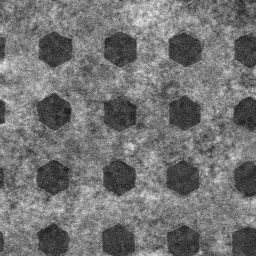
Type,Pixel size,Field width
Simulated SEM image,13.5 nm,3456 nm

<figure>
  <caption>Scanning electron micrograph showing a regular array of raised bodies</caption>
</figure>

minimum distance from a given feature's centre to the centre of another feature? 856 nm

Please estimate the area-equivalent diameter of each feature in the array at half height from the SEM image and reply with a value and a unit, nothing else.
478 nanometres